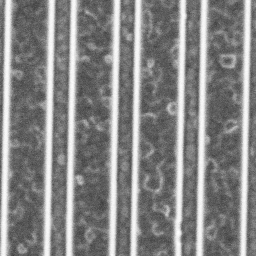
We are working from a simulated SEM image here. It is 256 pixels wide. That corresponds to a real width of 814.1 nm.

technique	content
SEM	one or a few lines or trenches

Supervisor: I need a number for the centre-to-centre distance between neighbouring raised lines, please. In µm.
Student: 0.207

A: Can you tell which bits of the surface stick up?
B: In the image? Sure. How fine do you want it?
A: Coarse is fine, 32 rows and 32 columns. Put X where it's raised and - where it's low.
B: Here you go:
-XXXXX---XXXXXX--XXXXXX---XXXXX-
-XXXXX---XXXXXX--XXXXXX---XXXXX-
-XXXXX---XXXXXX--XXXXXX--XXXXXX-
-XXXXX---XXXXXX--XXXXXX--XXXXXX-
-XXXXX---XXXXXX--XXXXXX--XXXXXX-
-XXXXX---XXXXXX--XXXXXX--XXXXXX-
-XXXXX---XXXXXX--XXXXXX--XXXXXX-
-XXXXX---XXXXXX--XXXXXX--XXXXXX-
-XXXXX---XXXXXX--XXXXXX--XXXXXX-
-XXXXX---XXXXXX--XXXXXX--XXXXXX-
-XXXXX---XXXXX---XXXXXX--XXXXXX-
-XXXXX---XXXXX---XXXXXX--XXXXXX-
-XXXXX---XXXXX---XXXXXX--XXXXXX-
-XXXXX---XXXXX---XXXXXX--XXXXXX-
-XXXXX---XXXXX---XXXXXX--XXXXXX-
-XXXXX---XXXXX---XXXXXX--XXXXXX-
-XXXXX---XXXXX---XXXXXX--XXXXXX-
-XXXXX---XXXXX---XXXXXX--XXXXXX-
-XXXXX---XXXXX---XXXXXX--XXXXXX-
-XXXXX---XXXXX---XXXXXX--XXXXXX-
-XXXXX---XXXXX---XXXXXX--XXXXXX-
-XXXXX---XXXXX---XXXXXX--XXXXXX-
-XXXXX---XXXXX---XXXXXX--XXXXXX-
-XXXXX---XXXXX---XXXXX---XXXXXX-
-XXXXX---XXXXX---XXXXX---XXXXXX-
-XXXXX---XXXXX---XXXXX---XXXXX--
XXXXXX---XXXXX---XXXXX---XXXXX--
XXXXXX---XXXXX---XXXXX---XXXXX--
XXXXXX---XXXXX---XXXXX---XXXXX--
XXXXXX---XXXXX---XXXXX---XXXXX--
XXXXXX---XXXXX---XXXXX---XXXXX--
XXXXXX---XXXXX---XXXXX---XXXXX--